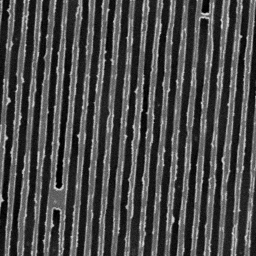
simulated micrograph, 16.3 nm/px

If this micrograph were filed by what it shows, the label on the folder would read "parallel lines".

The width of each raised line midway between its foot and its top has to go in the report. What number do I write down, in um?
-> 0.0873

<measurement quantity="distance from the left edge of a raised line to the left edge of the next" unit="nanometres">217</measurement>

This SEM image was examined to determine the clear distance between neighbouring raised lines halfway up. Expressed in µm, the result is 0.128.